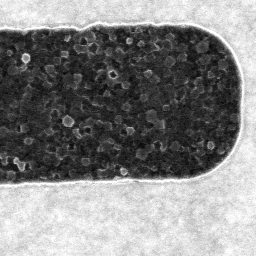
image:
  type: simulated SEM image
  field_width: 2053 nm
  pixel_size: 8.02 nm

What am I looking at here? one or a few lines or trenches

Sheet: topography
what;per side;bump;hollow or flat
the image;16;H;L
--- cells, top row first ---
LLLLLLLLLLLLLLLL
LLLLLLHHHHHHLLLL
HHHHHHHHHHHHHHLL
HHHHHHHHHHHHHHHL
HHHHHHHHHHHHHHHL
HHHHHHHHHHHHHHHL
HHHHHHHHHHHHHHHL
HHHHHHHHHHHHHHHL
HHHHHHHHHHHHHHHL
HHHHHHHHHHHHHHHL
HHHHHHHHHHHHHHLL
HHLHLLLLLLLLLLLL
LLLLLLLLLLLLLLLL
LLLLLLLLLLLLLLLL
LLLLLLLLLLLLLLLL
LLLLLLLLLLLLLLLL